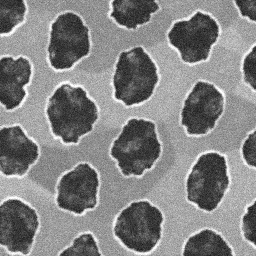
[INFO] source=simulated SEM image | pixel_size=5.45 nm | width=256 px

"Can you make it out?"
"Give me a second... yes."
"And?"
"a regular array of holes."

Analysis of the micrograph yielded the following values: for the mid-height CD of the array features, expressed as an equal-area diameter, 268 nanometers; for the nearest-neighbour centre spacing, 0.391 micrometres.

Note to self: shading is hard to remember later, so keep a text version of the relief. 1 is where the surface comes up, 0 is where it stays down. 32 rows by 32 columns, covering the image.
00011111111111000000111111111000
00011111111111000001111111111100
00011110001111000001111000011110
00111100000111110111100000011111
11111100000111111111100000011111
11111100000111111111100000011111
11111100000111110011110000111110
00011100001111100001111000111110
00001110011111000000111111111100
00001111111111000000111111111100
00011111111111000000111100111110
00011110000111000001111100011111
00011100000111100011111000001111
10111100000011111111111000001111
11111100000011111111111000011111
11111100000011110001111000011111
00011110000111100001111000111111
00001111001111000000111111111110
00000111111111000000111111111100
00000111111111000000111110001100
00001111110111100001111100001110
00011111100011100011111100001111
11111110000011111111111000000111
11111110000011111111111000001111
11111110000011111111111000001111
00011110000011110001111100011110
00001111101111100000111111111110
00000111111111100000111111111100
00000111111111000000111111111100
00001111110011100000111100001100
00001111100011100000111000001111
10001111000011111001111000000111